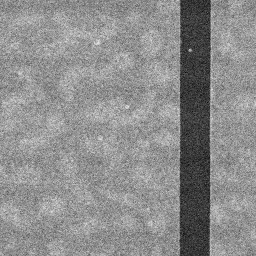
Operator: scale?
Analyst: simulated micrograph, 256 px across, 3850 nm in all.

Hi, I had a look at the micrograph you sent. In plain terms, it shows one or a few lines or trenches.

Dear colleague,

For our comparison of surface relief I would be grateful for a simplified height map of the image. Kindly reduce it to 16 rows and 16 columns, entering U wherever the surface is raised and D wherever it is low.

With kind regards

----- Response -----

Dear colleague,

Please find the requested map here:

UUUUUUUUUUUDDUUU
UUUUUUUUUUUDDUUU
UUUUUUUUUUUDDUUU
UUUUUUUUUUUDDUUU
UUUUUUUUUUUDDUUU
UUUUUUUUUUUDDUUU
UUUUUUUUUUUDDUUU
UUUUUUUUUUUDDUUU
UUUUUUUUUUUDDUUU
UUUUUUUUUUUDDUUU
UUUUUUUUUUUDDUUU
UUUUUUUUUUUDDUUU
UUUUUUUUUUUDDUUU
UUUUUUUUUUUDDUUU
UUUUUUUUUUUDDUUU
UUUUUUUUUUUDDUUU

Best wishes